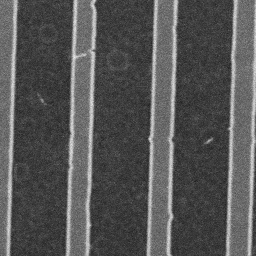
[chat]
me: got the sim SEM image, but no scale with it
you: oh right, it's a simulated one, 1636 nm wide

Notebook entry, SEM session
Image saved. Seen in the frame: one or a few lines or trenches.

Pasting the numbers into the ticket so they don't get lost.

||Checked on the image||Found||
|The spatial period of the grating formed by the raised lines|515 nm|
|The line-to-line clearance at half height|380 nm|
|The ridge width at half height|132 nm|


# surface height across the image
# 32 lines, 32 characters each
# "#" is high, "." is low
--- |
##.......###.......###........##
##.......###.......###.......###
##.......###.......###.......###
##.......###.......###.......###
##.......###.......###.......###
##.......###.......###.......###
##.......###.......###.......###
##.......###.......###.......###
##.......###.......###.......###
##.......###.......###.......###
##.......###.......###.......###
##.......##........###.......###
##.......##........###.......###
##.......##........###.......###
#........##........###.......###
#........##........###.......###
#........##........##........###
#........##........##........###
#........##........##........###
#........##........##........###
#........##........##........###
#........##........##........##.
#........##........##........##.
#........##........##........##.
#........##........##........##.
#........##........##........##.
#........##........##........##.
#........##........##........##.
#........##........##........##.
#........##........##........##.
#........##........##.......###.
#........##........##.......###.